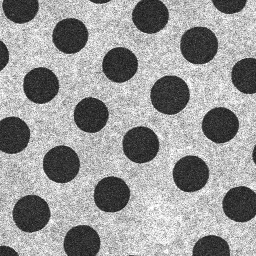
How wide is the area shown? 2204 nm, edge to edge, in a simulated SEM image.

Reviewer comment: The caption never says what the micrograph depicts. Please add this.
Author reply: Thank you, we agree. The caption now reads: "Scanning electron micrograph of a regular array of holes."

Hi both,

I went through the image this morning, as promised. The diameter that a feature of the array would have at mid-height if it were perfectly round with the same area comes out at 314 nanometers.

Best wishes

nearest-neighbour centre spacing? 0.496 microns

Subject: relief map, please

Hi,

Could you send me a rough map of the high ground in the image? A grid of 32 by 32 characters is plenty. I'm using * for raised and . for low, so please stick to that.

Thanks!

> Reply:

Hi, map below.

.....************...*******....*
.....************....*******..**
*...****..*******....***********
*******....******...****..******
*******....************....*****
.******....************....*****
.*******..****..*******....*****
.************....******...****..
****..*******....************...
***....******....****.*******...
***....************....******...
***....************.....******..
****..****..*******.....********
*********....******....****.****
*********.....************....**
...******....************.....**
....*******.****...******.....**
....***********.....******...***
...****..******.....************
******....******...****.********
*****.....************....******
******....************....******
******...****..*******....******
************....******...****..*
***..*******....************....
**....******....************....
**....*******.**************....
**....***********************..*
**...****...********************
********....**************.*****
********.....***********....****
..******....************.....***